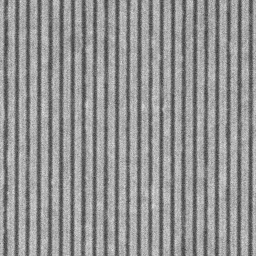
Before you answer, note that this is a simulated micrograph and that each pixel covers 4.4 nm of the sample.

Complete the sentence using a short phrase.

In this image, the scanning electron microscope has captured parallel lines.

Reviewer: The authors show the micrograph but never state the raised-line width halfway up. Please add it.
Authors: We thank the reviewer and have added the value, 0.0253 microns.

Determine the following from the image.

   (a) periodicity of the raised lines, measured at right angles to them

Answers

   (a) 49 nm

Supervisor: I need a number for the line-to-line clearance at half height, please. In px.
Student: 5.75